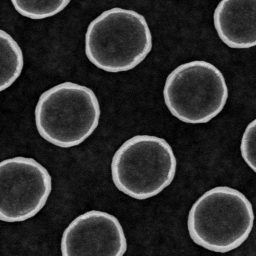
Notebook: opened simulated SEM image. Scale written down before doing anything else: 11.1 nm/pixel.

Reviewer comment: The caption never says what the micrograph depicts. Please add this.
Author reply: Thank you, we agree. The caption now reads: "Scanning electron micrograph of raised bodies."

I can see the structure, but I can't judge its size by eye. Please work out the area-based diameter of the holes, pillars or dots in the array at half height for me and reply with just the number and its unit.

668 nm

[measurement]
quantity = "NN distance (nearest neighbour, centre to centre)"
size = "1010 nm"